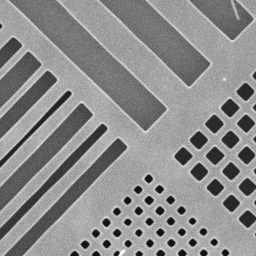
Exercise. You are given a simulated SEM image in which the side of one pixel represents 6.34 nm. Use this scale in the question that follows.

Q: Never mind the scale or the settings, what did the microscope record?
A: groups of lines, slits or small figures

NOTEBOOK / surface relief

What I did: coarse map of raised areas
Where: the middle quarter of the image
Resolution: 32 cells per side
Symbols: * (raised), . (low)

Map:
***............***********......
****............***********.....
*****............***********....
******............***********...
*******............***********..
********............***********.
**********...........***********
..*********...........**********
.***********...........*********
*************...........********
***..*********...........*******
**....*********...........******
**.....*********.........*******
*......**********.......********
......************.....*********
.....****.*********...**********
....****...*********.***********
...****...**********************
..****...***********************
.****...****...*****************
****...****.....****************
***...****......*************..*
**...****......*************....
*...*****.....**************....
...*****....*****************..*
..*****....*********************
.*****....**********************
*****....***********************
****.....***********..**********
***.....*************.**********
**.....***********.****.********
*.....***********...***..*******